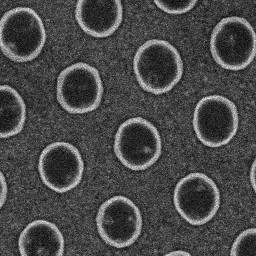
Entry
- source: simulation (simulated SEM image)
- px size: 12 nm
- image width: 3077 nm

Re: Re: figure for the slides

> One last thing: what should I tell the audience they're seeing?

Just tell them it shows raised bodies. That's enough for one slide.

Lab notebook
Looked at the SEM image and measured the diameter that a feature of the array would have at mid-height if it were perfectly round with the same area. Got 547 nanometers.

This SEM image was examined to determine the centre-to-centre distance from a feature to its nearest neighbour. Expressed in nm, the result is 960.